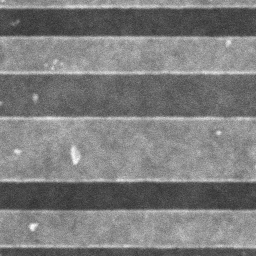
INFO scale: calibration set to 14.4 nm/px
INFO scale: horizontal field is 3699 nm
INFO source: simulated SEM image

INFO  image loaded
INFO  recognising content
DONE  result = lines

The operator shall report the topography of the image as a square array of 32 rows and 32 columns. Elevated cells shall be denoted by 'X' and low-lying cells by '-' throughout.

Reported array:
XXXXXXXXXXXXXXXXXXXXXXXXXXXXXXXX
--------------------------------
--------------------------------
--------------------------------
--------------------------------
XXXXXXXXXXXXXXXXXXXXXXXXXXXXXXXX
XXXXXXXXXXXXXXXXXXXXXXXXXXXXXXXX
XXXXXXXXXXXXXXXXXXXXXXXXXXXXXXXX
XXXXXXXXXXXXXXXXXXXXXXXXXXXXXXXX
--------------------------------
--------------------------------
--------------------------------
--------------------------------
--------------------------------
--------------------------------
XXXXXXXXXXXXXXXXXXXXXXXXXXXXXXXX
XXXXXXXXXXXXXXXXXXXXXXXXXXXXXXXX
XXXXXXXXXXXXXXXXXXXXXXXXXXXXXXXX
XXXXXXXXXXXXXXXXXXXXXXXXXXXXXXXX
XXXXXXXXXXXXXXXXXXXXXXXXXXXXXXXX
XXXXXXXXXXXXXXXXXXXXXXXXXXXXXXXX
XXXXXXXXXXXXXXXXXXXXXXXXXXXXXXXX
XXXXXXXXXXXXXXXXXXXXXXXXXXXXXXXX
--------------------------------
--------------------------------
--------------------------------
XXXXXXXXXXXXXXXXXXXXXXXXXXXXXXXX
XXXXXXXXXXXXXXXXXXXXXXXXXXXXXXXX
XXXXXXXXXXXXXXXXXXXXXXXXXXXXXXXX
XXXXXXXXXXXXXXXXXXXXXXXXXXXXXXXX
XXXXXXXXXXXXXXXXXXXXXXXXXXXXXXXX
--------------------------------